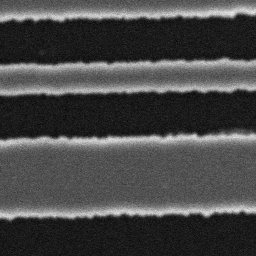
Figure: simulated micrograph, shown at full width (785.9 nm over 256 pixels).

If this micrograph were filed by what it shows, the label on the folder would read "lines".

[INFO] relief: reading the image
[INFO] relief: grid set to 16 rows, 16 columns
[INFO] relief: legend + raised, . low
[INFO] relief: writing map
++++++++++++++++
................
................
................
++++++++++++++++
++++++++++++++++
................
................
...........+.+++
++++++++++++++++
++++++++++++++++
++++++++++++++++
++++++++++++++++
++++++..........
................
................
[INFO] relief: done